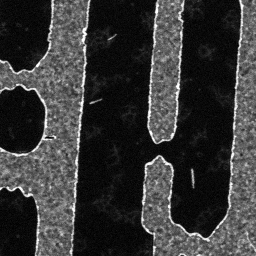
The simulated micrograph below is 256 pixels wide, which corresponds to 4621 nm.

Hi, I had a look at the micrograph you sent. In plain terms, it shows one or a few lines or trenches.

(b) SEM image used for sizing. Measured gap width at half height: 1180 nm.